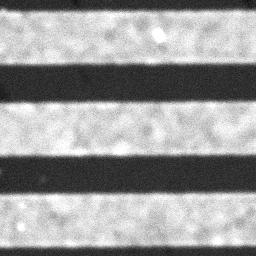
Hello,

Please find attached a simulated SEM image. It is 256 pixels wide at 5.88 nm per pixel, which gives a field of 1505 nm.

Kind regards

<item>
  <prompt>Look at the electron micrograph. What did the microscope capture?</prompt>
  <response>wiring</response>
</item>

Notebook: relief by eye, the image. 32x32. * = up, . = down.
................................
............................***.
********************************
********************************
********************************
********************************
********************************
********************************
................................
................................
................................
................................
................................
********************************
********************************
********************************
********************************
********************************
********************************
................................
................................
................................
................................
................................
********************************
********************************
********************************
********************************
********************************
********************************
********************************
................................